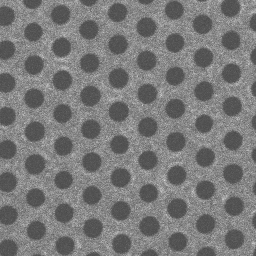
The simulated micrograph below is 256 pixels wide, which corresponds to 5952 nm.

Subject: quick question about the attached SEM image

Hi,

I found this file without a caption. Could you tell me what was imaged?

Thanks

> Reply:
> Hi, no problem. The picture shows a regular array of holes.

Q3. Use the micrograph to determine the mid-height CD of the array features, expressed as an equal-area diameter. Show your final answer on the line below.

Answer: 467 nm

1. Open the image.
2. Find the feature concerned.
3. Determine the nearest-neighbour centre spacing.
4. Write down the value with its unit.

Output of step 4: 32.2 pixels